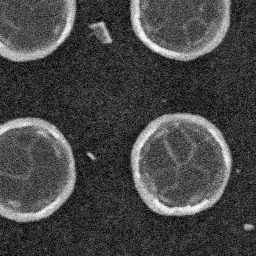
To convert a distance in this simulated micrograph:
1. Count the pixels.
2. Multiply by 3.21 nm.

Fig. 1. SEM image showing raised bodies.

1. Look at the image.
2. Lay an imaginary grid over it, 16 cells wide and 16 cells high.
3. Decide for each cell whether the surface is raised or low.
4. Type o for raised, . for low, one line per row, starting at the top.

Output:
ooooo...oooooo..
oooo....oooooo..
oooo.....ooooo..
.oo.......oo....
................
................
................
..........ooo...
oooo.....ooooo..
oooo.....ooooo..
ooooo...oooooo..
ooooo....ooooo..
oooo.....oooo...
.o..............
................
................